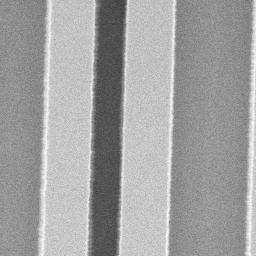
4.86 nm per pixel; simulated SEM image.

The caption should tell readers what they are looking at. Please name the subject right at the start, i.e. lines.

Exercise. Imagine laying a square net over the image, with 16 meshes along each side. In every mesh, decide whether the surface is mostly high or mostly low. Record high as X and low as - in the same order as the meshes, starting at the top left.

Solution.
---XXX--XXX-----
---XXX--XXX-----
---XXX--XXX-----
---XXX--XXX-----
---XXX--XXX-----
---XXX--XXX-----
---XXX--XXX-----
---XXX--XXX-----
---XXX--XXX-----
---XXX--XXX-----
---XXX--XXX-----
---XXX--XXX-----
---XXX--XXX-----
---XXX-XXXX-----
---XXX-XXX------
---XX--XXX------